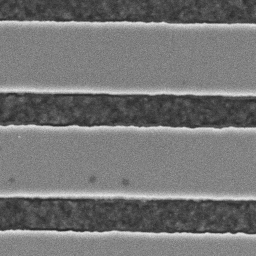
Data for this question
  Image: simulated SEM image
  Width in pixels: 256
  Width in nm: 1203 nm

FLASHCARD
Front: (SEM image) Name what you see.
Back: lines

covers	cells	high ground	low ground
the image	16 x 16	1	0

0000000000000000
1111111111101000
1111111111111111
1111111111111111
1111111111111111
1111111111111111
0000000000000000
0000000000000000
1111111111111111
1111111111111111
1111111111111111
1111111111111111
0000000000000111
0000000000000000
1111111110000000
1111111111111111